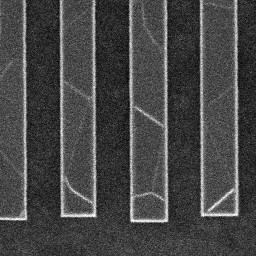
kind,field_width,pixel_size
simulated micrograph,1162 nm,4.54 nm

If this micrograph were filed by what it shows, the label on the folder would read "one or a few lines or trenches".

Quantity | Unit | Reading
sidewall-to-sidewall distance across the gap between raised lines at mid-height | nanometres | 161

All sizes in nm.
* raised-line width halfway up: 161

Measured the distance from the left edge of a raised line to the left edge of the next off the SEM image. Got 320 nm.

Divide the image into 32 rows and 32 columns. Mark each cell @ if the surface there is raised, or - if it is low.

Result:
@@@-----@@@@----@@@@@----@@@@---
@@@-----@@@@----@@@@@----@@@@---
@@@-----@@@@----@@@@@----@@@@---
@@@-----@@@@----@@@@@----@@@@@--
@@@-----@@@@----@@@@@----@@@@@--
@@@-----@@@@----@@@@@----@@@@@--
@@@-----@@@@----@@@@@----@@@@@--
@@@-----@@@@----@@@@@----@@@@@--
@@@-----@@@@----@@@@@----@@@@@--
@@@-----@@@@----@@@@@----@@@@@--
@@@-----@@@@----@@@@@----@@@@@--
@@@-----@@@@----@@@@@----@@@@@--
@@@-----@@@@----@@@@@----@@@@@--
@@@-----@@@@----@@@@@----@@@@@--
@@@-----@@@@----@@@@@----@@@@@--
@@@-----@@@@----@@@@@----@@@@@--
@@@-----@@@@----@@@@@----@@@@@--
@@@-----@@@@----@@@@@----@@@@@--
@@@-----@@@@----@@@@@----@@@@@--
@@@-----@@@@----@@@@@----@@@@@--
@@@-----@@@@----@@@@@----@@@@@--
@@@-----@@@@----@@@@@----@@@@@--
@@@-----@@@@----@@@@@----@@@@@--
@@@-----@@@@----@@@@@----@@@@@--
@@@-----@@@@----@@@@@----@@@@@--
@@@-----@@@@----@@@@@----@@@@@--
@@@-----@@@@----@@@@@----@@@@@--
-----------------@@@@-----------
--------------------------------
--------------------------------
--------------------------------
--------------------------------